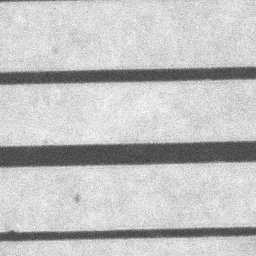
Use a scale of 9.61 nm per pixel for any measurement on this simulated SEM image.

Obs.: one or a few lines or trenches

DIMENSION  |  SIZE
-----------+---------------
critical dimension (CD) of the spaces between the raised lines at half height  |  594 nm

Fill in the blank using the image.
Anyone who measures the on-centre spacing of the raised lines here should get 760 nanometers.